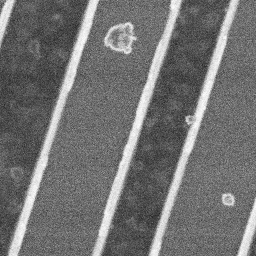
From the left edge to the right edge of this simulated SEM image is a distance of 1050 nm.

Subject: one or a few lines or trenches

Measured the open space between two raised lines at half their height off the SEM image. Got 218 nanometres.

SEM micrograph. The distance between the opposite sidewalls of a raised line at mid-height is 333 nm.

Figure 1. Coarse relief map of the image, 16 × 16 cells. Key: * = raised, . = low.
*.....*****...**
.....******...**
.....*****....**
.....*****....**
....******...***
....*****....***
....*****....***
...******...****
...*****....****
...*****....****
..******...*****
..*****....*****
..*****....*****
.******...******
.******...******
.*****....*****.